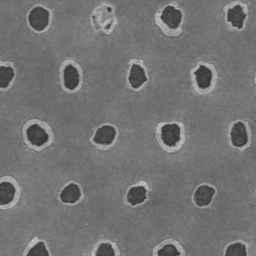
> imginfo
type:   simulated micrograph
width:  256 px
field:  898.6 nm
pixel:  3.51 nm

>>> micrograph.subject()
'a regular array of holes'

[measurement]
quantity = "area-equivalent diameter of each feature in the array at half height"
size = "0.0788 µm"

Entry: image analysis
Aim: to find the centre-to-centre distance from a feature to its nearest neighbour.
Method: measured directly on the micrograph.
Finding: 0.231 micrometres